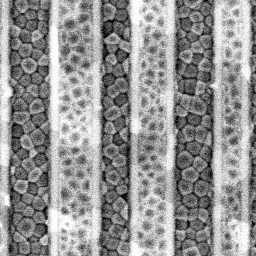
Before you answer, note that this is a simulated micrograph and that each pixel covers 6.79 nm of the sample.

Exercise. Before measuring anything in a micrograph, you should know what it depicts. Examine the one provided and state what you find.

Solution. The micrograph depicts one or a few lines or trenches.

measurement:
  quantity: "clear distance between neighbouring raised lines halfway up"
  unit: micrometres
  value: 0.33